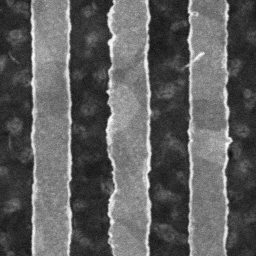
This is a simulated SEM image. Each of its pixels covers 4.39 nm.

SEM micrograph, one or a few lines or trenches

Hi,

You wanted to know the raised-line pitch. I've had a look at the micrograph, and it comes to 344 nanometres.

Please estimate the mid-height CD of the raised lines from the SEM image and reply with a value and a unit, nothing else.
0.16 micrometres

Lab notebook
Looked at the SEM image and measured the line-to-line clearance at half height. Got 182 nanometres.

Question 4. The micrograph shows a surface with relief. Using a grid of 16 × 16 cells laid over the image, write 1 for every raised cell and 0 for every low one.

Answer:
0011000110001100
0011000110001100
0011000110001100
0011000110001100
0011000110001100
0011000110001100
0011000110001100
0011000110001100
0011000110001100
0011000110001100
0011000110001100
0011000110001100
0011000110001100
0011000110001100
0011000110001100
0011000110001100